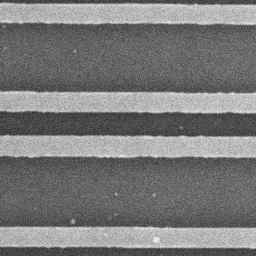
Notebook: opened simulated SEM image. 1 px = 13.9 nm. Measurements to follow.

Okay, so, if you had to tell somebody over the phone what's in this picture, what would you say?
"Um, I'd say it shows lines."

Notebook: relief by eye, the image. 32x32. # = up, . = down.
##..............................
################################
################################
................................
................................
................................
................................
................................
................................
................................
................................
................................
################################
################################
................................
................................
................................
################################
################################
..###.......#####..####..#######
................................
................................
................................
................................
................................
................................
................................
................................
####################............
################################
################################
................................